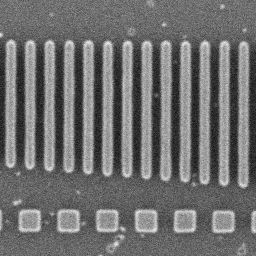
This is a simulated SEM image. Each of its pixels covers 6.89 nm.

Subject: groups of lines, slits or small figures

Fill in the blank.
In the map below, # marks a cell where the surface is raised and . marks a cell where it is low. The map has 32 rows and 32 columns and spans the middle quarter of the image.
##...##...##...##...##..##...##.
##...##...##...##...##..##...##.
##...##...##...##...##..###..##.
##...##...##...##...##..###..##.
##...##...##...##...##..###..###
##...##...##...##...##..###..###
##...##...##...##...##..##...###
##...##...##...##...##...#...###
##...##...##...##...##...#...##.
##...##...##...##...##...#...##.
##...##...##...##...##...#...##.
##...##...##...##...##...#...##.
##...##...##...##...##...#...##.
##...##...##...##...##...#...##.
##...##...##...##...##..##...##.
##...##...##...##...##..##...##.
##...##...##...##...##..##...##.
##...##...##...##...##..##...##.
##...##...##...##...##..##...##.
##...##...##...##...##...#...##.
##...##...##...##...##...#...##.
##...##...##...##...##...#...##.
##...##...##...##...##..##...##.
##...##...##...##...##..##...##.
##...##...##...##...##..##...##.
##...##...##...##...##..##...##.
##...##...##...##...##..##...##.
..........#....##...##..##...##.
.........................#...##.
................................
................................
................................